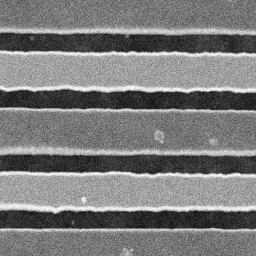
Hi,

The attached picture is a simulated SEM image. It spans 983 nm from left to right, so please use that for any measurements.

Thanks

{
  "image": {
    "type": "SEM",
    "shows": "lines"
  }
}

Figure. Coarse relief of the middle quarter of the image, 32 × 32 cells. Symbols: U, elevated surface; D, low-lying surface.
UUUUUUUUUUUUUUUUUUUUUUUUUUUUUUUU
UUUUUUUUUUUUUUUUUUUUUUUUUUUUUUUU
UUUUUUUUUUUUUUUUUUUUUUUUUUUUUUUU
UUUUUUUUUUUUUUUUUUUUUUUUUUUUUUUU
UUUUUUUUUUUUUUUUUUUUUUUUUUUUUUUU
UUUUUUUUUUUUUUUUUUUUUUUUUUUUUUUU
DDUUUUUUUUUUUUUUDUUUUUUUUUUUUUUU
DDDDDDDDDDDDDDDDDDDDDDDDDDDDDDDD
DDDDDDDDDDDDDDDDDDDDDDDDDDDDDDDD
DDDDDDDDDDDDDDDDDDDDDDDDDDDDDDDD
DDDDDDDDDDDDDDDDDDDDDDDDDDDDDDDD
UUUUUUUUUUUUUUUUUUUUUUUUUUUUUUUU
UUUUUUUUUUUUUUUUUUUUUUUUUUUUUUUU
UUUUUUUUUUUUUUUUUUUUUUUUUUUUUUUU
UUUUUUUUUUUUUUUUUUUUUUUUUUUUUUUU
UUUUUUUUUUUUUUUUUUUUUUUUUUUUUUUU
UUUUUUUUUUUUUUUUUUUUUUUUUUUUUUUU
UUUUUUUUUUUUUUUUUUUUUUUUUUUUUUUU
UUUUUUUUUUUUUUUUUUUUUUUUUUUUUUUU
UUUUUUUUUUUUUUUUUUUUUUUUUUUUUUUU
UUUUUUUUUUUUUUUUUUUUUUUUUUUUUUUU
UUUUUUUUUUUUUUUUUUUUUUUUUUUUUUUU
UUUUUUUUUUUUUUUUUUUUUDDUUUUUUUUU
DDDDDDDDDDDDDDDDDDDDDDDDDDDDDDDD
DDDDDDDDDDDDDDDDDDDDDDDDDDDDDDDD
DDDDDDDDDDDDDDDDDDDDDDDDDDDDDDDD
DDDDDDDDDDDDDDDDDDDDDDDDDDDDDDDD
UUUUUUUUUUUUUUUUUUDDDDDUDUUUUUDD
UUUUUUUUUUUUUUUUUUUUUUUUUUUUUUUU
UUUUUUUUUUUUUUUUUUUUUUUUUUUUUUUU
UUUUUUUUUUUUUUUUUUUUUUUUUUUUUUUU
UUUUUUUUUUUUUUUUUUUUUUUUUUUUUUUU